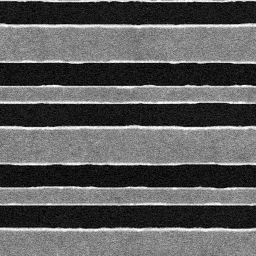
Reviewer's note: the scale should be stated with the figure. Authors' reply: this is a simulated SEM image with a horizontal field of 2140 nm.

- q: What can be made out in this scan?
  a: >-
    lines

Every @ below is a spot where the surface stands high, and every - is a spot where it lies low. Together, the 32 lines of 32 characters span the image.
--------------------------------
--------------------------------
--------------------------------
@@@@@@@@@@@@@@@@@@@@@@@@@@@@@@@@
@@@@@@@@@@@@@@@@@@@@@@@@@@@@@@@@
@@@@@@@@@@@@@@@@@@@@@@@@@@@@@@@@
@@@@@@@@@@@@@@@@@@@@@@@@@@@@@@@@
@@@@@@@@@@@@@@@@@@@@@@@@@@@@@@@@
--------------------------------
--------------------------------
--------------------------------
@@@@@@@@@@@@@@@@@@@@@@@@@@@@@@@@
@@@@@@@@@@@@@@@@@@@@@@@@@@@@@@@@
--------------------------------
--------------------------------
--------------------------------
@@@@@@@@@@@@@@@@@@@@@@@@@@@@@@@@
@@@@@@@@@@@@@@@@@@@@@@@@@@@@@@@@
@@@@@@@@@@@@@@@@@@@@@@@@@@@@@@@@
@@@@@@@@@@@@@@@@@@@@@@@@@@@@@@@@
-@@@@@@@@@@@@@@@@@@@@@@----@@@@@
--------------------------------
--------------------------------
----@@@@@@@@---@@@@-----@@------
@@@@@@@@@@@@@@@@@@@@@@@@@@@@@@@@
@@@@@@@@@@@@@@@@@@@@@@@@@@@@@@@@
--------------------------------
--------------------------------
--------------------------------
@@@@@@@@@@@@@@@@@@@@@@@@@@@@@@@@
@@@@@@@@@@@@@@@@@@@@@@@@@@@@@@@@
@@@@@@@@@@@@@@@@@@@@@@@@@@@@@@@@